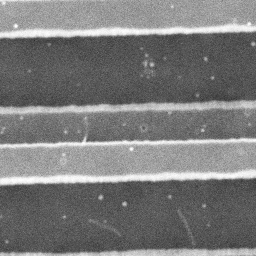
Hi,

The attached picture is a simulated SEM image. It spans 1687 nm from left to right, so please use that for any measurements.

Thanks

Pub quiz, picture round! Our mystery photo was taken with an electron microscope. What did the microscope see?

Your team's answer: lines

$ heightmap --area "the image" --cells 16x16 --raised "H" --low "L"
HHHHHHHHHHHHHHHH
HHHHHHHHHHHHHHHH
LLLLLLLLLLLLLLLL
LLLLLLLLLLLLLLLL
LLLLLLLLLLLLLLLL
LLLLLLLLLLLLLLLL
LLLLLLLLLLLLLLLL
LLLLLLLLLLLLLLLL
LLLLLLLLLLLLLLLL
HHHHHHHHHHHHHHHH
HHHHHHHHHHHHHHHH
HLLLLLLLLLLLLLLL
LLLLLLLLLLLLLLLL
LLLLLLLLLLLLLLLL
LLLLLLLLLLLLLLLL
LLLLLLLLLLLLLLLL